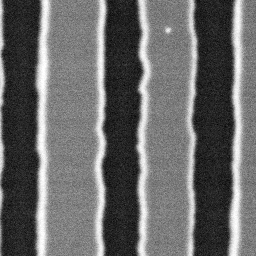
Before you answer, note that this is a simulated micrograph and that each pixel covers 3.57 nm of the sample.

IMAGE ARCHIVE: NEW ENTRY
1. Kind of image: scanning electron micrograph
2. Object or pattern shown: lines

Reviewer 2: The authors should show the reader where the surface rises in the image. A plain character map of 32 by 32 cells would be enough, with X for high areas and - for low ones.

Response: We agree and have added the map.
------XXXXXXX-----XXXXXX------XX
-----XXXXXXXX-----XXXXXX------XX
-----XXXXXXXX-----XXXXXX------XX
-----XXXXXXXX-----XXXXXX-----XXX
-----XXXXXXXX-----XXXXXX-----XXX
-----XXXXXXXX-----XXXXXX-----XXX
-----XXXXXXXX-----XXXXXX------XX
-----XXXXXXXX-----XXXXXX------XX
-----XXXXXXXX-----XXXXXX------XX
-----XXXXXXXX-----XXXXXX------XX
-----XXXXXXXX-----XXXXXX-----XXX
-----XXXXXXXX-----XXXXXX-----XXX
-----XXXXXXXX-----XXXXXX-----XXX
-----XXXXXXXX-----XXXXXX-----XXX
-----XXXXXXXX-----XXXXXX------XX
-----XXXXXXXX-----XXXXXX------XX
-----XXXXXXXX-----XXXXXX------XX
-----XXXXXXXX-----XXXXXX-----XXX
-----XXXXXXXX----XXXXXXX-----XXX
-----XXXXXXXX-----XXXXXX-----XXX
-----XXXXXXX------XXXXXX-----XXX
-----XXXXXXXX-----XXXXXX-----XXX
-----XXXXXXXX-----XXXXXX-----XXX
-----XXXXXXXX-----XXXXXX-----XXX
-----XXXXXXXX-----XXXXXX-----XXX
-----XXXXXXXX-----XXXXXX-----XXX
-----XXXXXXXX-----XXXXXX-----XXX
-----XXXXXXXX-----XXXXXX-----XXX
-----XXXXXXXX-----XXXXXX-----XXX
-----XXXXXXXX-----XXXXXX-----XXX
-----XXXXXXXX-----XXXXXX-----XXX
-----XXXXXXXX-----XXXXXX-----XXX